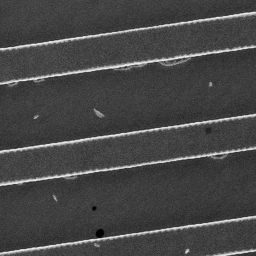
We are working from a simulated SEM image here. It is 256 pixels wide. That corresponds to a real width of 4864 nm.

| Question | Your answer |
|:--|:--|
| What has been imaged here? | lines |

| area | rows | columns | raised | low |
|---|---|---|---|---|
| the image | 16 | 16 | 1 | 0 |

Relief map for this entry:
0000000000000000
0000000000011111
0000111111111111
1111111111110000
1111100000000000
0000000000000000
0000000000000000
0000000000000011
0000000111111111
1111111111111110
1111111100000000
1000000000000000
0000000000000000
0000000000000000
0000000001111111
0011111111111111